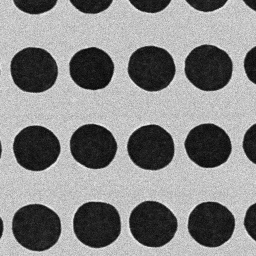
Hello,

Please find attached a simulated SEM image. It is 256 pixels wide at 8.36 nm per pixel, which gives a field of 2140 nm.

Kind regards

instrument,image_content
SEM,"a regular array of holes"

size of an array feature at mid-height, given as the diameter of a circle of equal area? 392 nanometers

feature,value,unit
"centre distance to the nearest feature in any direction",0.477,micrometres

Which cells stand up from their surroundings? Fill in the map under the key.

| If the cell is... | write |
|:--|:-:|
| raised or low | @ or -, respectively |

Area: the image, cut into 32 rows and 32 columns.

@@-----@@-----@@-----@@@----@@@-
@@@---@@@@---@@@@@--@@@@@@@@@@@@
@@@@@@@@@@@@@@@@@@@@@@@@@@@@@@@@
@@@@@@@@@@@@@@@@@@@@@@@@@@@@@@@@
@@@@@@@@@@@@@@@@@@@@@@@@@@@@@@@@
@@@@@@@@@@@@@@@@@@@@@@@@@@@@@@@@
@@----@@@@---@@@@----@@@----@@@-
@@-----@@-----@@------@------@@-
@------@@-----@@------@------@@-
@------@@-----@@------@------@@-
@@-----@@@----@@@----@@@----@@@@
@@@--@@@@@@@@@@@@@@@@@@@@@@@@@@@
@@@@@@@@@@@@@@@@@@@@@@@@@@@@@@@@
@@@@@@@@@@@@@@@@@@@@@@@@@@@@@@@@
@@@@@@@@@@@@@@@@@@@@@@@@@@@@@@@@
@@@@@@@@@@@-@@@@@@@@@@@@@--@@@@@
@@-----@@-----@@@----@@@----@@@-
@@-----@@-----@@------@------@--
@@------@------@------@------@--
@@-----@@-----@@------@@-----@@-
@@-----@@@----@@@----@@@@---@@@@
@@@@@@@@@@@@@@@@@@@@@@@@@@@@@@@@
@@@@@@@@@@@@@@@@@@@@@@@@@@@@@@@@
@@@@@@@@@@@@@@@@@@@@@@@@@@@@@@@@
@@@@@@@@@@@@@@@@@@@@@@@@@@@@@@@@
@@@@-@@@@@----@@@---@@@@@---@@@@
@@-----@@------@-----@@@-----@@-
@@------@------@------@@-----@--
@@------@------@------@------@@-
@@------@@-----@@-----@@-----@@-
@@-----@@@----@@@@---@@@@---@@@@
@@@@@@@@@@@@@@@@@@@@@@@@@@@@@@@@